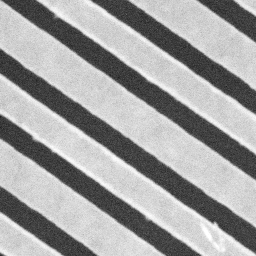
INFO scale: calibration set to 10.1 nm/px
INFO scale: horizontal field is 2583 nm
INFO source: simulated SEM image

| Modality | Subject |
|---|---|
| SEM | lines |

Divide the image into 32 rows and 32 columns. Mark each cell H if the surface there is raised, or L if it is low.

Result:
HLLLLHHHHHHHLLLLLHHHHHHHHLLLLLHH
HHLLLLLHHHHHHLLLLLHHHHHHHHHLLLLH
HHHLLLLLHHHHHHHLLLLLHHHHHHHHLLLL
HHHHHLLLLLHHHHHHLLLLLHHHHHHHHLLL
HHHHHHLLLLLHHHHHHHLLLLLHHHHHHHHL
HHHHHHHHLLLLHHHHHHHLLLLLHHHHHHHH
LHHHHHHHHLLLLLHHHHHHHLLLLHHHHHHH
LLHHHHHHHHLLLLLHHHHHHHLLLLLHHHHH
LLLHHHHHHHHHLLLLLHHHHHHLLLLLHHHH
LLLLLHHHHHHHHLLLLLHHHHHHHLLLLLHH
HHLLLLHHHHHHHHHLLLLHHHHHHHLLLLLH
HHHLLLLLHHHHHHHHLLLLLHHHHHHHLLLL
HHHHLLLLLHHHHHHHHHLLLLHHHHHHHLLL
HHHHHHLLLLLHHHHHHHHLLLLLHHHHHHHL
HHHHHHHLLLLLHHHHHHHHLLLLLHHHHHHH
LLHHHHHHHLLLLLHHHHHHHHLLLLLHHHHH
LLLHHHHHHHLLLLLHHHHHHHHLLLLLHHHH
LLLLLHHHHHHHLLLLHHHHHHHHHLLLLLHH
HHLLLLHHHHHHHLLLLLHHHHHHHHLLLLLH
HHHLLLLLHHHHHHLLLLLHHHHHHHHHLLLL
HHHHHLLLLHHHHHHHLLLLLHHHHHHHHLLL
HHHHHHLLLLLHHHHHHLLLLLHHHHHHHHLL
HHHHHHHLLLLLHHHHHHHLLLLHHHHHHHHH
HHHHHHHHHLLLLHHHHHHHLLLLLHHHHHHH
LLHHHHHHHHLLLLLHHHHHHLLLLLHHHHHH
LLLHHHHHHHHHLLLLHHHHHHHLLLLLHHHH
LLLLLHHHHHHHHLLLLLHHHHHHLLLLLHHH
HLLLLLHHHHHHHHLLLLLHHHHHHHLLLLLH
HHHLLLLLHHHHHHHHLLLLHHHHHHHLLLLL
HHHHLLLLLHHHHHHHHLLLLLHHHHHHHLLL
HHHHHHLLLLHHHHHHHHHLLLLHHHHHHHLL
HHHHHHHLLLLLHHHHHHHHLLLLLHHHHHHL